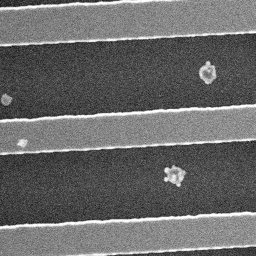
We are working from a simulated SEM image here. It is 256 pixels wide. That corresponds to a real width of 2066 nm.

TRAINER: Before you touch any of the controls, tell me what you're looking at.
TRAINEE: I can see lines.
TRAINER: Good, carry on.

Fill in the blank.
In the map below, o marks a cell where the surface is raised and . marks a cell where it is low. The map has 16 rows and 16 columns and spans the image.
oooooooooooooooo
oooooooooooooooo
oooooooo........
................
................
................
................
oooooooooooooooo
oooooooooooooooo
ooo.............
................
................
................
............oooo
oooooooooooooooo
oooooooooooooo..